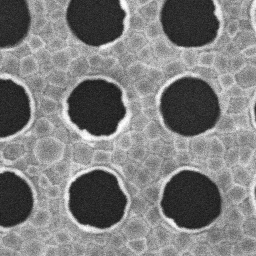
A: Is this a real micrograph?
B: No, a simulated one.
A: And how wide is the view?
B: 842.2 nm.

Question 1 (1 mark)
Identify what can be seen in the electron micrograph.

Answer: holes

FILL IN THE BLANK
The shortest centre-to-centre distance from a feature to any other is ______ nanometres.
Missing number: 305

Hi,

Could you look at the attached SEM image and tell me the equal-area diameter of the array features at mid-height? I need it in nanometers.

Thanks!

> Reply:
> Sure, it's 192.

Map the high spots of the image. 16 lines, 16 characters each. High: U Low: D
DDUUDDDDUUDDDUUU
DDUUDDDDUUDDDDUU
DUUUUDDUUUUDDUUU
UUUUUUUUUUUUUUUU
UUUUUUUUUUUUUUUU
DUUUUDDUUUDDDUUU
DDUUDDDDUUDDDDUU
DDUUDDDDUUDDDDUU
UUUUUUUUUUUUUUUU
UUUUUUUUUUUUUUUU
UUUUUUUUUUUUUUUU
DDUUUDDUUUDDDUUU
DDUUDDDDUUDDDDUU
DDUUUDDDUUDDDDUU
UUUUUUUUUUUUUUUU
UUUUUUUUUUUUUUUU